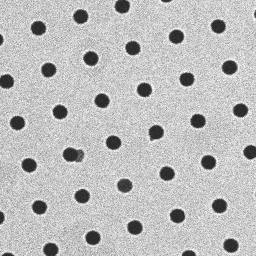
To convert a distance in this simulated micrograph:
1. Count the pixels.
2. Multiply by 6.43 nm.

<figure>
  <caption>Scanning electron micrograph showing a regular array of holes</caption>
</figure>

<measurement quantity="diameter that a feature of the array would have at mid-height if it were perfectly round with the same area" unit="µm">0.0979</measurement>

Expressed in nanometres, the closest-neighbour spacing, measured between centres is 277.